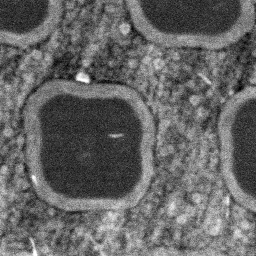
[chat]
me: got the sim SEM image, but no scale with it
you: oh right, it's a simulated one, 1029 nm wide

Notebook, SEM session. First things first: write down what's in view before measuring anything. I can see raised bodies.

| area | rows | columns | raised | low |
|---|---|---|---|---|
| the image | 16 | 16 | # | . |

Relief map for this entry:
####....########
###......######.
.#........####..
................
................
...##...........
..#######......#
..#######.....##
..#######.....##
..#######.....##
..#######.....##
..#######.....##
...#####.......#
................
................
................